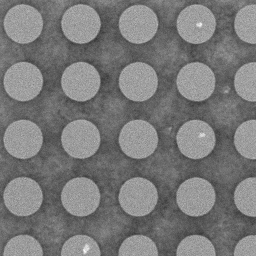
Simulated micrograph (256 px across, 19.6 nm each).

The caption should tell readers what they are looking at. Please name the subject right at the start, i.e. an array of small figures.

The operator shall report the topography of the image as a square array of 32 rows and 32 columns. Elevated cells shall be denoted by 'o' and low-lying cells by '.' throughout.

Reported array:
................................
.oooo...oooo....ooo....ooo....oo
.oooo...oooo...ooooo..ooooo..ooo
.oooo...oooo...ooooo..ooooo..ooo
.oooo...oooo...oooo....ooo....oo
................................
................................
................................
.oooo...oooo....ooo....ooo....oo
.oooo...oooo...ooooo..ooooo..ooo
.oooo...oooo...ooooo..ooooo..ooo
.oooo...oooo...oooo...ooooo...oo
..o.......o......o......o......o
................................
................................
.ooo.....ooo....ooo....ooo....oo
.oooo...oooo...oooo...ooooo..ooo
.oooo...oooo...ooooo..ooooo..ooo
.oooo...oooo...oooo...ooooo...oo
..oo.....oo.....oo.....ooo.....o
................................
................................
..oo.....oo.....oo.....ooo.....o
.oooo...oooo...oooo...ooooo...oo
.oooo...oooo...ooooo..ooooo..ooo
.oooo...oooo...oooo...ooooo..ooo
.ooo.....ooo....ooo....ooo....oo
................................
................................
..oo.....oo......o......o......o
.oooo...oooo...oooo...oooo....oo
ooooo...oooo...ooooo..ooooo..ooo